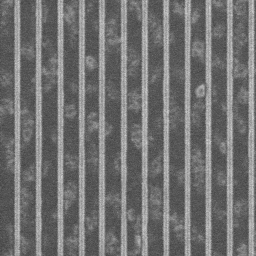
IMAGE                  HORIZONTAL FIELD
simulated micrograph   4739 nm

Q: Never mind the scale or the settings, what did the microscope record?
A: parallel lines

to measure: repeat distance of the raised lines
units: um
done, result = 0.394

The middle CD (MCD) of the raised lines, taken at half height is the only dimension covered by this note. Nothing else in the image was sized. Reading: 55.5 nanometres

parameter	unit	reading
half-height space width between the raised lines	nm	333